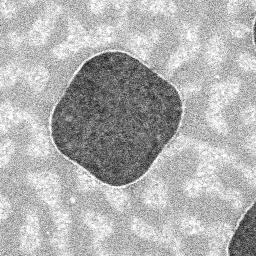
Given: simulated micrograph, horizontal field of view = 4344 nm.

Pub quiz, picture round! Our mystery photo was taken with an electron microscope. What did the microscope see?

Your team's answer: raised bodies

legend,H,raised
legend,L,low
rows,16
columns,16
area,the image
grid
LLLLLLLLLLLLLLLL
LLLLLLLLLLLLLLLL
LLLLLLLLLLLLLLLL
LLLLLLHHLLLLLLLL
LLLLLHHHHHLLLLLL
LLLLHHHHHHHLLLLL
LLLLHHHHHHHLLLLL
LLLHHHHHHHHLLLLL
LLLHHHHHHHHLLLLL
LLLLHHHHHHLLLLLL
LLLLLHHHHLLLLLLL
LLLLLLLHLLLLLLLL
LLLLLLLLLLLLLLLL
LLLLLLLLLLLLLLLH
LLLLLLLLLLLLLLLH
LLLLLLLLLLLLLLHH